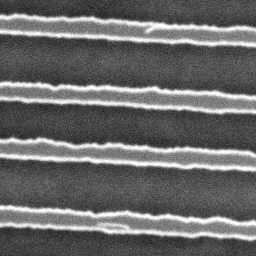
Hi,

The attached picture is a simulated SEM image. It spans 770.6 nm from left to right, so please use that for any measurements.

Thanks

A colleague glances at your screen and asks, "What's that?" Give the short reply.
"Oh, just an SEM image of lines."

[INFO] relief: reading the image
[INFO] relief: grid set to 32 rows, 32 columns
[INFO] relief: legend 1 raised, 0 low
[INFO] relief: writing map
00000000000000000000000000000000
00000000000000000000000000000000
11111111111110000000000000000000
11111111111111111111111111101111
00000000111111111111111111111111
00000000000000000000000011111111
00000000000000000000000000000000
00000000000000000000000000000000
00000000000000000000000000000000
00000000000000000000000000000000
11111000000000000000000000000000
11111111111111111111111111100000
11111111111111111111111111111111
00000000000000000001111111111111
00000000000000000000000000000000
00000000000000000000000000000000
00000000000000000000000000000000
01001100000000000000000000000000
11111111111111111110000100000000
11111111111111111111111111111111
00000000000000001111111111111111
00000000000000000000000000000000
00000000000000000000000000000000
00000000000000000000000000000000
00000000000000000000000000000000
00000000000000000000000000000000
11111111111000010000000000000000
11111111111111111111111111111000
00000001111111111111111111111111
00000000000000000000001110111111
00000000000000000000000000000000
00000000000000000000000000000000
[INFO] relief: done